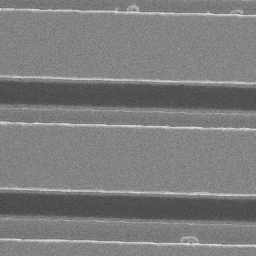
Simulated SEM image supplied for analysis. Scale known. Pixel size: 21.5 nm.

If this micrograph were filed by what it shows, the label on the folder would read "lines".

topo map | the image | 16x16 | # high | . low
################
################
################
################
################
................
................
################
################
################
################
################
................
................
################
################